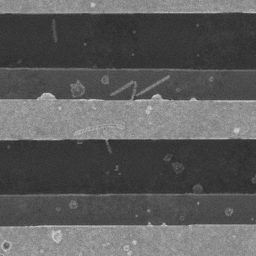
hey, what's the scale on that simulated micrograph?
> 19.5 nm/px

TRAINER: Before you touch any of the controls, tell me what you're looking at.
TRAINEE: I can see lines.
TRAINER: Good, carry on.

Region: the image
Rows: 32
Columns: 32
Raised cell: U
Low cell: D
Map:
UUUUUUUUUUUUUUUUUUUUUUUUUUUUUUUU
UUUUUUUUUUUUUUUUUUUUUUUUUUUUDDUU
DDDDDDDDDDDDDDDDDDDDDDDDDDDDDDDD
DDDDDDDDDDDDDDDDDDDDDDDDDDDDDDDD
DDDDDDDDDDDDDDDDDDDDDDDDDDDDDDDD
DDDDDDDDDDDDDDDDDDDDDDDDDDDDDDDD
DDDDDDDDDDDDDDDDDDDDDDDDDDDDDDDD
DDDDDDDDDDDDDDDDDDDDDDDDDDDDDDDD
DDDDDDDDDDDDDDDDDDDDDDDDDDDDDDDD
UUUUUUUUUUUUUUUUUUUUUUUUUUUUUUUU
UUUUUUUUUUUUUUUUUUUUUUUUUUUUUUUU
UUUUUUUUUUUUUUUUUUUUUUUUUUUUUUUU
UUUUUUUUUUUUUUUUUUUUUUUUUUUUUUUU
UUUUUUUUUUUUUUUUUUUUUUUUUUUUUUUU
UUUUUUUUUUUUUUUUUUUUUUUUUUUUUUUU
UUUUUUUUUUUUUUUUUUUUUUUUUUUUUUUU
UUUUUUUUUUUUUUUUUUUUUUUUUUUUUUUU
DDDDDDDDDDDDDDDDDDDDDDDDDDDDDDDD
DDDDDDDDDDDDDDDDDDDDDDDDDDDDDDDD
DDDDDDDDDDDDDDDDDDDDDDDDDDDDDDDD
DDDDDDDDDDDDDDDDDDDDDDDDDDDDDDDD
DDDDDDDDDDDDDDDDDDDDDDDDDDDDDDDD
DDDDDDDDDDDDDDDDDDDDDDDDDDDDDDDD
DDDDDDDDDDDDDDDDDDDDDDDDDDDDDDDD
UUUUUUUUUUUUUUUUUUUUUUUUUUUUUUUU
UUUUUUUUUUUUUUUUUUUUUUUUUUUUUUUU
UUUUUUUUUUUUUUUUUUUUUUUUUUUUUUUU
UUUUUUUUUUUUUUUUUUUUUUUUUUUUUUUU
UUUUUUUUUUUUUUUUUUUUUUUUUUUUUUUU
UUUUUUUUUUUUUUUUUUUUUUUUUUUUUUUU
UUUUUUUUUUUUUUUUUUUUUUUUUUUUUUUU
UUUUUUUUUUUUUUUUUUUUUUUUUUUUUUUU